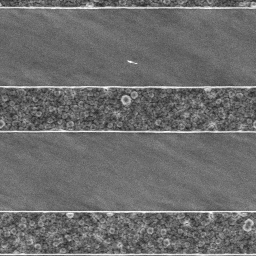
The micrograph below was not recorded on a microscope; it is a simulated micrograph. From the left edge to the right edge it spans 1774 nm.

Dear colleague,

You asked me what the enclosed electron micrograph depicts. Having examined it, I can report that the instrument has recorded one or a few lines or trenches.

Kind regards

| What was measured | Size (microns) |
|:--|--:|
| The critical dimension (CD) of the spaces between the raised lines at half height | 0.543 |